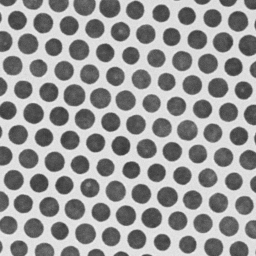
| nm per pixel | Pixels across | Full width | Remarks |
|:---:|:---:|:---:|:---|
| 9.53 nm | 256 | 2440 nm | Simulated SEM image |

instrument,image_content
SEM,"a regular array of holes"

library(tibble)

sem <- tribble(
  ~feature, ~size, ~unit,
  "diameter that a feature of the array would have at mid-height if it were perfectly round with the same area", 0.187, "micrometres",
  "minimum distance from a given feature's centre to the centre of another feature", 244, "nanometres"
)